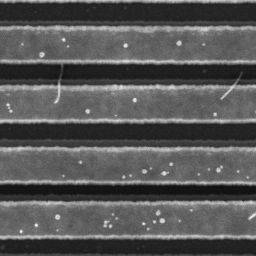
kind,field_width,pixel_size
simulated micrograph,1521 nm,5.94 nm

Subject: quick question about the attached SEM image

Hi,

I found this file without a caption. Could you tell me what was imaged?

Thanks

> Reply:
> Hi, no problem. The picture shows lines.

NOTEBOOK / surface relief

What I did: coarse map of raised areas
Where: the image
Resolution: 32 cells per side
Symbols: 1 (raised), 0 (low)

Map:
00000000000000000000000000000000
00000000000000000000000000000000
00000000000000000000000000000000
11111111111111111111111111111111
11111111111111111111111111111111
11111111111111111111111111111111
11111111111111111111111111111111
11111111111111111111111111111111
00000000000000000000000000000000
00000000000000000000000000000000
00000000000000000000000000000100
11111111111111111111111111111111
11111111111111111111111111111111
11111111111111111111111111111111
11111111111111111111111111111111
00000000000000000100000000000000
00000000000000000000000000000000
00000000000000000000000000000000
11111111111111111111111111111111
11111111111111111111111111111111
11111111111111111111111111111111
11111111111111111111111111111111
11111111111111111111111111111111
00000000000000000000000000000000
00000000000000000000000000000000
11111111111111111111111111111111
11111111111111111111111111111111
11111111111111111111111111111111
11111111111111111111111111111111
11111111111111111111111111111111
00000000000000000000000000000000
00000000000000000000000000000000